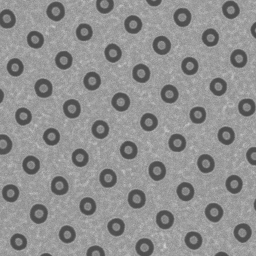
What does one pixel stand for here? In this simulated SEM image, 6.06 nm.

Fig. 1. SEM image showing a regular array of ring-shaped grooves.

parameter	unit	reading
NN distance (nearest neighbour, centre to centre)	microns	0.209